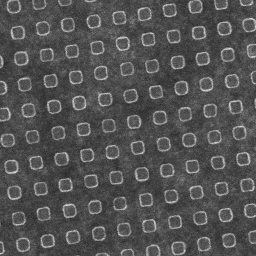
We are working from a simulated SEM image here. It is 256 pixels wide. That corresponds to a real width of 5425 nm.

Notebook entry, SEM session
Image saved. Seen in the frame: a regular array of raised bodies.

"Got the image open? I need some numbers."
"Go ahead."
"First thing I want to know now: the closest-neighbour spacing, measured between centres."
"0.539 microns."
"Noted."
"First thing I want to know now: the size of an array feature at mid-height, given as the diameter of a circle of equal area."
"0.295 micrometres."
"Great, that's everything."